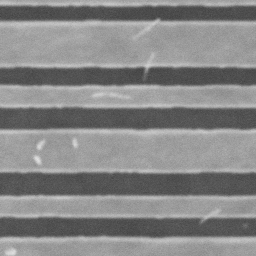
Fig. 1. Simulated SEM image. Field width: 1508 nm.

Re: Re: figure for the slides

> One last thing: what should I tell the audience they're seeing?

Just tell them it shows lines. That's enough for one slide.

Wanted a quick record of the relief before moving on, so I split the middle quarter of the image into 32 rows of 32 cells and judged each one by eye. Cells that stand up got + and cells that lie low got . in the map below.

++++++++++++++++++++++++++++++++
................................
................................
................................
................................
.......+.......+++++++++........
++++++++++++++++++++++++++++++++
++++++++++++++++++++++++++++++++
++++++++++++++++++++++++++++++++
++++++++++++++++++++++++++++++++
++++++++++++++++++++++++++++++++
................................
................................
................................
................................
................................
++..++++++++++++...........++.+.
++++++++++++++++++++++++++++++++
++++++++++++++++++++++++++++++++
++++++++++++++++++++++++++++++++
++++++++++++++++++++++++++++++++
++++++++++++++++++++++++++++++++
++++++++++++++++++++++++++++++++
++++++++++++++++++++++++++++++++
++++++++++++++++++++++++++++++++
++++++++++++++++++++++++++++++++
++++++++++++++++++++++++++++++++
................................
................................
................................
................................
................................